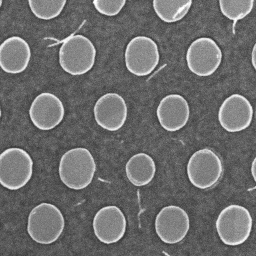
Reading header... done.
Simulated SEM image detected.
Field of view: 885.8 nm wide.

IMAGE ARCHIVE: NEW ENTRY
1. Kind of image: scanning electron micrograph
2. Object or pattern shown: a regular array of raised bodies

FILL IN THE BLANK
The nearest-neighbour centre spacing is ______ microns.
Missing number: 0.217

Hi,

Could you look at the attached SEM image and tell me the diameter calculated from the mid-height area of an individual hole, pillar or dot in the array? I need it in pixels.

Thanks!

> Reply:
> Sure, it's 35.1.